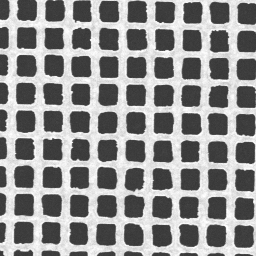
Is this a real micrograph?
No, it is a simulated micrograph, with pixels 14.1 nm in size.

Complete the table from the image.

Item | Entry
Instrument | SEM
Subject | a regular array of holes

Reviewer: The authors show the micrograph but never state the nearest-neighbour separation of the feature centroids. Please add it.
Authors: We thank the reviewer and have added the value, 385 nanometers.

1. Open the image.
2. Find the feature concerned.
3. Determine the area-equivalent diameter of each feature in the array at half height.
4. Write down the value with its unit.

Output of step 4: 321 nanometres